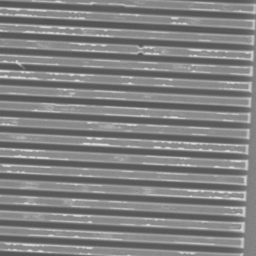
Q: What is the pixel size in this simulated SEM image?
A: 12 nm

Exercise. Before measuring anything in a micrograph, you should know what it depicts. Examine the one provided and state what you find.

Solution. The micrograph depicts parallel lines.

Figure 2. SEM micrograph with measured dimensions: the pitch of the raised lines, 187 nm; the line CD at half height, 115 nm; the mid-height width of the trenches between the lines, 70.2 nm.